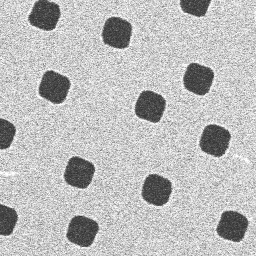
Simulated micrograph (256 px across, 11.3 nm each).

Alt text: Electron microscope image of a regular array of holes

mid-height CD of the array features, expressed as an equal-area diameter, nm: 358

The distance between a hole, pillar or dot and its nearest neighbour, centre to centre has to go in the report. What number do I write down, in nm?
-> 720